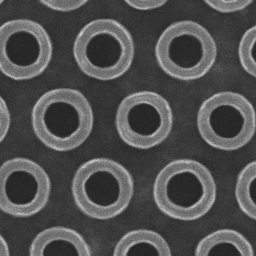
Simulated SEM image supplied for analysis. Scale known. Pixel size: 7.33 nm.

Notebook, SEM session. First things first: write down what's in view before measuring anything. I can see ring-shaped raised bodies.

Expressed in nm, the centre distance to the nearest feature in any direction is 595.